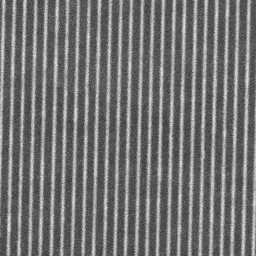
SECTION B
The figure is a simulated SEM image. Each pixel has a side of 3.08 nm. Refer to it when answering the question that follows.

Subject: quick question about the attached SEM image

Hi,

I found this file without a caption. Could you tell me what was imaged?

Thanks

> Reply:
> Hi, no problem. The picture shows parallel lines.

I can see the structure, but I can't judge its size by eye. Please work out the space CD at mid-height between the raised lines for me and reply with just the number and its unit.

8.12 pixels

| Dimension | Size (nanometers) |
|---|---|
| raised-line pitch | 32.8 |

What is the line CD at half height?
0.0069 micrometres